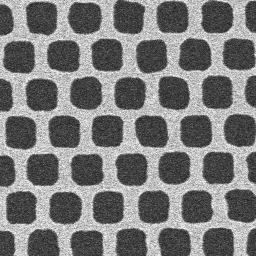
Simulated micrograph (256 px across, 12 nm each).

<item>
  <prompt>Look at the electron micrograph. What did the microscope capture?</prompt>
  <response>a regular array of holes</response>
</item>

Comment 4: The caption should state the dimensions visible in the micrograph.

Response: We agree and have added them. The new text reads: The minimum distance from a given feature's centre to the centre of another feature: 517 nanometers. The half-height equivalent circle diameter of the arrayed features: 412 nm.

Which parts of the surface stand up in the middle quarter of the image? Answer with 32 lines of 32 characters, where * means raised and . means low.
....***........***........***...
...*****......*****.....******..
********************************
****....******.....*****.....***
**.......****.......****.......*
**........***.......****.......*
*........****.......****.......*
*........****.......***.........
*.........***.......****........
**.......****.......****.......*
***......****.......****.......*
******.********....*********.***
********************************
...*****......****.......*****..
....***........***.......****...
....***........***........***...
....***........***........***...
....***........***........***...
....***........***........***...
....***.......*****.......***...
...*****......******.....*****..
********************************
*******.******.....******......*
**.......****.......****........
**........***........***........
*.........***........**.........
**........***........**........*
**........***........***........
**........***........***.......*
***......*****......*****.....**
*****.*********..*.*************
********************************